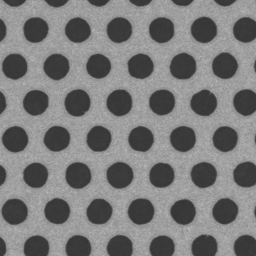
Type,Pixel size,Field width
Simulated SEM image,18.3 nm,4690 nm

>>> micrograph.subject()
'a regular array of holes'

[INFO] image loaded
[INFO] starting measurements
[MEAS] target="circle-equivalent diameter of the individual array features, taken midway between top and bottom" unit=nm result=475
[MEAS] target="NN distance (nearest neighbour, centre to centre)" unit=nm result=763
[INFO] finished